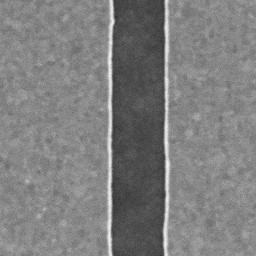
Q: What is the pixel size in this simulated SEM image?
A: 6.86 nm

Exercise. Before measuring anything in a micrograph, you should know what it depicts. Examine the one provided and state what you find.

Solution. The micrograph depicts one or a few lines or trenches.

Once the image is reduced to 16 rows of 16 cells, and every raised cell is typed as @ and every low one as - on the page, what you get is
@@@@@@@---@@@@@@
@@@@@@@---@@@@@@
@@@@@@@---@@@@@@
@@@@@@@---@@@@@@
@@@@@@@---@@@@@@
@@@@@@@---@@@@@@
@@@@@@@---@@@@@@
@@@@@@@---@@@@@@
@@@@@@@---@@@@@@
@@@@@@@---@@@@@@
@@@@@@@---@@@@@@
@@@@@@@---@@@@@@
@@@@@@@---@@@@@@
@@@@@@@---@@@@@@
@@@@@@@---@@@@@@
@@@@@@@---@@@@@@